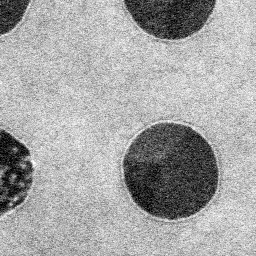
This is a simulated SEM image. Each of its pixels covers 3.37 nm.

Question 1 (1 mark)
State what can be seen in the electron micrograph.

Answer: raised bodies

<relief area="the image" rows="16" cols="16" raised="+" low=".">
++......+++++...
+.......+++++...
..........+.....
................
................
................
................
................
+.......+++++...
++......+++++...
++......++++++..
++......++++++..
++......+++++...
.........+++....
................
................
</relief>